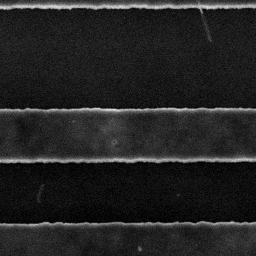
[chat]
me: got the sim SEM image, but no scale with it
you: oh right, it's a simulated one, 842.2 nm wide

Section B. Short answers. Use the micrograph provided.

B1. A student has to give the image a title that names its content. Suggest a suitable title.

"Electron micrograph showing lines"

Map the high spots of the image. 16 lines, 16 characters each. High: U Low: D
UDDDDDDDDDDDDDDD
DDDDDDDDDDDDDDDD
DDDDDDDDDDDDDDDD
DDDDDDDDDDDDDDDD
DDDDDDDDDDDDDDDD
DDDDDDDDDDDDDDDD
DDDDDDDDDDDDDDDD
UUUUUUUUUUUUUUUU
UUUUUUUUUUUUUUUU
UUUUUUUUUUUUUUUU
DDDDDDDDDDDDDDDD
DDDDDDDDDDDDDDDD
DDDDDDDDDDDDDDDD
DDDDDDDDDDDDDDDD
UUUUUUUUUUUUUUUU
UUUUUUUUUUUUUUUU